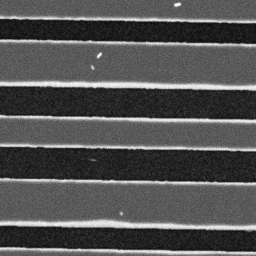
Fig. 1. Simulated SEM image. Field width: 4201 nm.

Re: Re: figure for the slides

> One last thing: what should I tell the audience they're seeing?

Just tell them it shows lines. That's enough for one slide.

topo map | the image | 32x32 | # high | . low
################################
################################
.................###############
................................
................................
#############################...
################################
################################
################################
################################
################################
................................
................................
................................
#...............................
################################
################################
################################
................#.##############
................................
................................
................................
#######.........................
################################
################################
################################
################################
################################
........................########
................................
................................
############################....